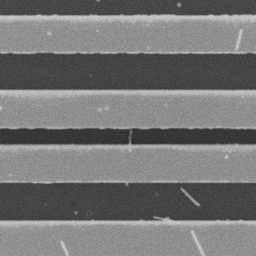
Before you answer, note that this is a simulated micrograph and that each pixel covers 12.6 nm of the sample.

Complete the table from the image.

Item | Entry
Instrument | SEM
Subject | lines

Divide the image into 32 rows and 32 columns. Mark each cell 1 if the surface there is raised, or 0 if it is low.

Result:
00000000000000000000000000000000
00000000000000000000000000000000
11111111111111111111111111111111
11111111111111111111111111111111
11111111111111111111111111111111
11111111111111111111111111111111
11111111111111111111111111111111
00000000000000000000000000000000
00000000000000000000000000000000
00000000000000000000000000000000
00000000000000000000000000000000
11111111111111111111111111111111
11111111111111111111111111111111
11111111111111111111111111111111
11111111111111111111111111111111
11111111111111111111111111111111
00000000000000000000000000000000
00000000000000000000000000000000
11111111111111111111111111111111
11111111111111111111111111111111
11111111111111111111111111111111
11111111111111111111111111111111
11111111111111111111111111111111
00000000000000000000000000000000
00000000000000000000000000000000
00000000000000000000000000000000
00000000000000000000000000000000
00000000000000000000000000000000
11111111111111111111111111111111
11111111111111111111111111111111
11111111111111111111111111111111
11111111111111111111111111111111